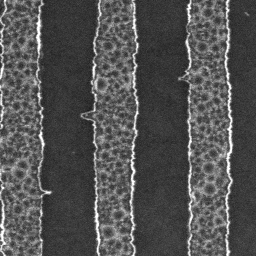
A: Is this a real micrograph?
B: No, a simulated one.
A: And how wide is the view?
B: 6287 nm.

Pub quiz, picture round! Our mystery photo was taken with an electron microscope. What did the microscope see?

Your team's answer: one or a few lines or trenches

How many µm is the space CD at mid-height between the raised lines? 1.35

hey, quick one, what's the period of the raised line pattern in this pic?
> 2300 nanometres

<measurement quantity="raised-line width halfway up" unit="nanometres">942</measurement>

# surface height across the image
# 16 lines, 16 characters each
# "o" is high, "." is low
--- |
ooo...oo....oo..
oo....oo....oo..
oo....oo....oo..
oo....oo....oo..
oo....oo....oo..
oo....oo....oo..
ooo...ooo...oo..
ooo...oo....oo..
ooo...oo....oo..
ooo...oo....oo..
oo....oo....oo..
ooo...oo....oo..
ooo...oo....oo..
ooo...oo....oo..
ooo...oo....oo..
ooo...oo....oo..